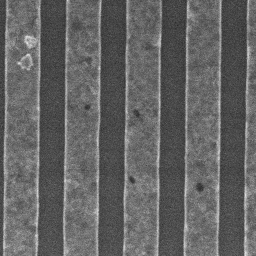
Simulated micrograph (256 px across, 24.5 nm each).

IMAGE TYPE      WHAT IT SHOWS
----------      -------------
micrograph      wiring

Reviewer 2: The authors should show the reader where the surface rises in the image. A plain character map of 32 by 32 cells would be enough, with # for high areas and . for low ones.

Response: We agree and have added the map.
.####...#####...####...#####...#
.####...#####...####...#####...#
.####...#####...####...#####...#
.####...####....####...#####...#
.####...#####...####...#####...#
.####...#####...####...#####...#
.####...#####...####...#####...#
.####...#####...####...#####...#
.####...####....####...####....#
.####...####....####...####....#
.####...####....####...####....#
.####...####....####...####....#
.####...####....####...####....#
.####...####....####...####....#
.####...####....####...####....#
.####...####....####...####....#
.####...####....####...####....#
.####...####....####...####....#
.####...####....####...####....#
.####...####....####...####....#
.####...####....####...####....#
.####...####....####...####....#
.####...####....####...####....#
.####...####....####...####....#
.####...####....####...####....#
.####...####....####...####....#
.####...####....####...####....#
.####...####....####...####....#
.####...####....####...####....#
.####...####....####...####....#
.####...####....####...####....#
.####...####...#####...####....#